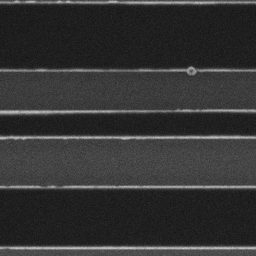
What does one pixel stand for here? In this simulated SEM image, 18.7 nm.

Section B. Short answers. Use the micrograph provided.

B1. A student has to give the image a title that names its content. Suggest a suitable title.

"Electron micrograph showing lines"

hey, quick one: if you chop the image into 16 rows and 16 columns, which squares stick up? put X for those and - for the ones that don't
XXXXXXXXXXXXXXXX
XXXXXXXXXXXXXXXX
XXXXXXXXXXXXXXXX
XXXXXXXXXXXXXXXX
-----------X----
----------------
----------------
XXXXXXXXXXXXXXXX
XXXXXXXXXXXXXXXX
----------------
----------------
----------------
XXXXXXXXXXXXXXXX
XXXXXXXXXXXXXXXX
XXXXXXXXXXXXXXXX
XXXXXXXXXXXXXXXX